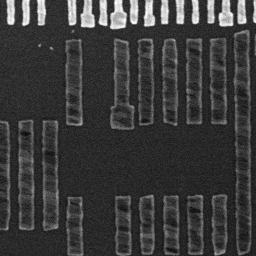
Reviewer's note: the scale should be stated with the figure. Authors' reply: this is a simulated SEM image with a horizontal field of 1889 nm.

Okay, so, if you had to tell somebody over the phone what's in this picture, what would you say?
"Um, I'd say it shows wiring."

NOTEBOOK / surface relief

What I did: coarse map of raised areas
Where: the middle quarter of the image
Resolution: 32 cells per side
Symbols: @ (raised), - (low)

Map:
-@@@---------@@@---@@@---@@@---@
-@@@---------@@@---@@@---@@@---@
-@@@---------@@@---@@@---@@@---@
-@@@---------@@@---@@@---@@@---@
-@@@---------@@@---@@@---@@@---@
-@@@---------@@@---@@@---@@@---@
-@@@---------@@@---@@@---@@@---@
-@@@---------@@@---@@@---@@@---@
-@@@---------@@@---@@@---@@@---@
-@@@---------@@@---@@@---@@@---@
-@@@---------@@@@--@@@---@@@---@
-@@@--------@@@@@--@@@---@@@---@
-@@@--------@@@@@--@@@---@@@---@
-@@@--------@@@@@--@@@---@@@---@
-@@@--------@@@@@--@@@----@@---@
------------@@@@@---------------
--------------------------------
--------------------------------
--------------------------------
--------------------------------
--------------------------------
--------------------------------
--------------------------------
--------------------------------
--------------------------------
--------------------------------
--------------------------------
--------------------------------
--------------------------------
--------------------------------
--------------------------------
--------------------------------